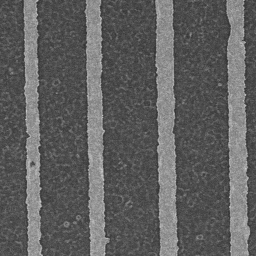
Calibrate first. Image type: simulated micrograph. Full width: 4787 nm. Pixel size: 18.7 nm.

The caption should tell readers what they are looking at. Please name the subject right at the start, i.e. one or a few lines or trenches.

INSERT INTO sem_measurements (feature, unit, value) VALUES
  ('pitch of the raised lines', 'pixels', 68.3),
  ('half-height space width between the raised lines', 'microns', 1.02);